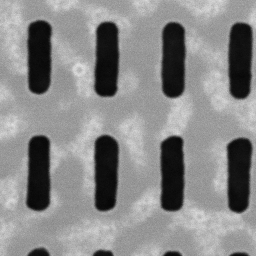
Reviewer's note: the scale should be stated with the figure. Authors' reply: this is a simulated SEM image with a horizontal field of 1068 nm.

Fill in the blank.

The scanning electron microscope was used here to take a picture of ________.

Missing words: a regular array of holes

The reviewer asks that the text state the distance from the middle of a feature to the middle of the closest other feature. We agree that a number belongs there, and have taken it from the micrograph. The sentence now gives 278 nanometres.